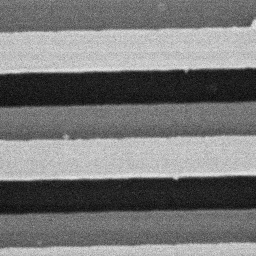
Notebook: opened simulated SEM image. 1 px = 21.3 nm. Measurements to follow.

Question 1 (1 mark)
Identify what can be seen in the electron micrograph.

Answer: lines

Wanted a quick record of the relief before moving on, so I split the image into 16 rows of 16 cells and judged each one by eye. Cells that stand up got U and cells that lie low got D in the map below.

UUUUUUUUUUUUUUUU
UUUUUUUUUUUUUUUU
UUUUUUUUUUUUUUUU
UUUUUUUUUUUUUUUU
UUDDDDDDDDDDDDDD
DDDDDDDDDDDDDDDD
DDDDDDDDDDDDUUUU
UUUUUUUUUUUUUUUU
UUUUUUUUUUUUUUUU
UUUUUUUUUUUUUUUU
UUUUUUUUUUUUUUUU
DDDDDDDDDDDDDDDD
DDDDDDDDDDDDDDDD
UUUUUUUUUUUUUUUU
UUUUUUUUUUUUUUUU
UUUUUUUUUUUUUUUU